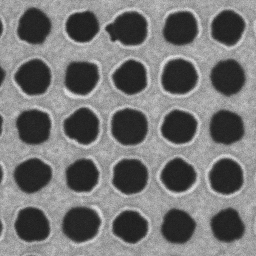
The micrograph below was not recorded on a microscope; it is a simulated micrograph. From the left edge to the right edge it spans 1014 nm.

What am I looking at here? a regular array of holes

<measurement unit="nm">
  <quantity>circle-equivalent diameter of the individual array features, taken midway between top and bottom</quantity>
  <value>136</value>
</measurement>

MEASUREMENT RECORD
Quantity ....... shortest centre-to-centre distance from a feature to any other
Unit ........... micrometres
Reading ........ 0.19